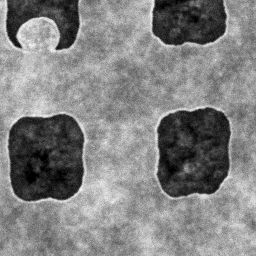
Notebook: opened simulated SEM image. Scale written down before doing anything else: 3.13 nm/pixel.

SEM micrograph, holes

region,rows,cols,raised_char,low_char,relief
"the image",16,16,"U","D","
DDDDDUUUUUDDDDUU
DDUDDUUUUDDDDDUU
UUUUDUUUUUDDDDUU
UUUUUUUUUUUUUUUU
UUUUUUUUUUUUUUUU
UUUUUUUUUUUUUUUU
UUUUUUUUUUUUUUUU
UDDDDUUUUUDDDDUU
UDDDDUUUUUDDDDUU
UDDDDUUUUUDDDDUU
UDDDDUUUUUDDDDUU
UDDDDUUUUUDDDDUU
UDDUUUUUUUUUUUUU
UUUUUUUUUUUUUUUU
UUUUUUUUUUUUUUUU
UUUUUUUUUUUUUUUU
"